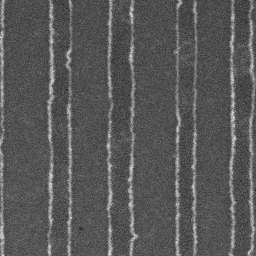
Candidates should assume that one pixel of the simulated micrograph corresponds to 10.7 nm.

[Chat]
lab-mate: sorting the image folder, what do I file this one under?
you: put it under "one or a few lines or trenches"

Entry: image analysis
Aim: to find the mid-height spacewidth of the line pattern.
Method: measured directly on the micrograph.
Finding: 432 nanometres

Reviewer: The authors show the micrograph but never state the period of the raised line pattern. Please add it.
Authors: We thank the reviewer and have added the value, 0.649 um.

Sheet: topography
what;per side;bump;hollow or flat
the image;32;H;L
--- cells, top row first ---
LLLLLLHHHLLLLLHHHLLLLLHHLLLLLHHL
LLLLLLHHHLLLLLHHHLLLLLHHLLLLLHHL
LLLLLLHHHLLLLLHHHLLLLLHHLLLLLHHL
LLLLLLHHHLLLLLHHHLLLLLHHLLLLLHHL
LLLLLLHHHLLLLLHHHLLLLLHHLLLLLHHL
LLLLLLHHHLLLLLHHHLLLLLHHHLLLLHHL
LLLLLLHHHLLLLLHHHLLLLLHHHLLLLHHL
LLLLLLHHHLLLLLHHLLLLLLHHLLLLLHHH
LLLLLLHHHLLLLLHHHLLLLLHHLLLLLHHH
LLLLLLHHHLLLLLHHHLLLLLHHLLLLLHHH
LLLLLLHHHLLLLLHHHLLLLLHHLLLLLHHH
LLLLLLHHHLLLLLHHHLLLLLHHLLLLLHHH
LLLLLLHHHLLLLLHHHLLLLLHHLLLLLHHH
LLLLLLHHHLLLLLHHHLLLLLHHLLLLLHHH
LLLLLLHHHLLLLLHHHLLLLLHHLLLLLHHL
LLLLLLHHHLLLLLHHHLLLLLHHLLLLLHHL
LLLLLLHHHLLLLLHHHLLLLLHHLLLLLHHL
LLLLLLHHHLLLLLHHHLLLLLHHLLLLLHHL
LLLLLLHHHLLLLHHHHLLLLLHHLLLLLHHL
LLLLLLHHHLLLLLHHHLLLLLHHLLLLLHHL
LLLLLLHHHLLLLLHHHLLLLLHHLLLLLHHL
LLLLLLHHHLLLLLHHHLLLLLHHLLLLLHHL
LLLLLLHHHLLLLLHHLLLLLLHHLLLLLHHL
LLLLLLHHHLLLLLHHLLLLLLHHLLLLLHHL
LLLLLLHHHLLLLLHHHLLLLLHHLLLLLHHH
LLLLLLHHHLLLLLHHHLLLLLHHLLLLLHHH
LLLLLLHHHLLLLLHHHLLLLLHHLLLLLHHH
LLLLLLHHHLLLLLHHHLLLLLHHLLLLLHHH
LLLLLLHHHLLLLLHHHLLLLLHHLLLLLHHH
LLLLLLHHHLLLLLHHHLLLLLHHLLLLLHHH
LLLLLLHHHLLLLLHHHLLLLLHHHLLLLHHH
LLLLLLHHHLLLLLHHHLLLLLHHLLLLLHHL